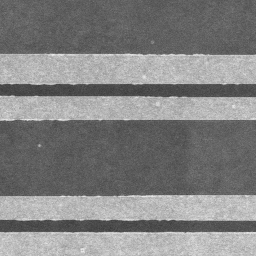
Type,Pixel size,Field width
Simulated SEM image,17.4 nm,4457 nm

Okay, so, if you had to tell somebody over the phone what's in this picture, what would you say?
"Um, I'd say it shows lines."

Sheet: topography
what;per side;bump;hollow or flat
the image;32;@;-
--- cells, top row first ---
--------------------------------
--------------------------------
--------------------------------
--------------------------------
--------------------------------
--------------------------------
--------------------------------
@@@@@@@@@@@@@@@@@@@@@@@@@@@@@@@@
@@@@@@@@@@@@@@@@@@@@@@@@@@@@@@@@
@@@@@@@@@@@@@@@@@@@@@@@@@@@@@@@@
@@--@@@-@@@-----@@---@------@@--
--------------------------------
@@@@@@@@@@@@@@@@@@@@@@@@@@@@@@@@
@@@@@@@@@@@@@@@@@@@@@@@@@@@@@@@@
@@@@@@@@@@@@@@@@@@@@@@@@@@@@@@@@
--------------------------------
--------------------------------
--------------------------------
--------------------------------
--------------------------------
--------------------------------
--------------------------------
--------------------------------
--------------------------------
--------------------------------
@@@@@@@@@@@@@@@@@@@@@@@@@@@@@@@@
@@@@@@@@@@@@@@@@@@@@@@@@@@@@@@@@
--------------------------------
--------------------------------
@@@@@@@@@@@@@@@@@@@@@@@@@@@@@@@@
@@@@@@@@@@@@@@@@@@@@@@@@@@@@@@@@
@@@@@@@@@@@@@@@@@@@@@@@@@@@@@@@@